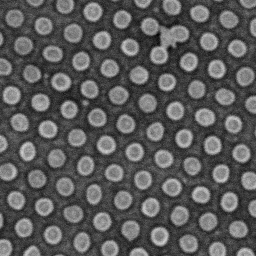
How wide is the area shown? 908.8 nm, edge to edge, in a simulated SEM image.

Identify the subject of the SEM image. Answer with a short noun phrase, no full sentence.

a regular array of raised bodies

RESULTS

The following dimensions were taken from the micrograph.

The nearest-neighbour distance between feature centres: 101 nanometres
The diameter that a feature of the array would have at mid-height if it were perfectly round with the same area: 16.3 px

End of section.